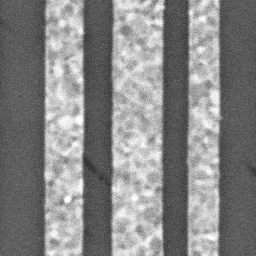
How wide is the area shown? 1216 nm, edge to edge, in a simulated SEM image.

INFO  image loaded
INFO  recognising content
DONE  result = one or a few lines or trenches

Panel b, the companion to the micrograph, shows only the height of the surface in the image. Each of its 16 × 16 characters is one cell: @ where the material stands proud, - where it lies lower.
---@@--@@@--@@--
---@@--@@@--@@--
---@@--@@@--@@--
---@@--@@@--@@--
---@@--@@@--@@--
---@@--@@@--@@--
---@@--@@@--@@--
---@@--@@@--@@--
---@@--@@@--@@--
---@@--@@@--@@--
---@@--@@@--@@--
---@@--@@@--@@--
---@@--@@@--@@--
---@@--@@@--@@--
---@@--@@@--@@--
---@@--@@@--@@--